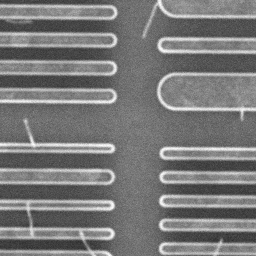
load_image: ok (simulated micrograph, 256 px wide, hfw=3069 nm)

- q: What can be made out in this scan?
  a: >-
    groups of lines, slits or small figures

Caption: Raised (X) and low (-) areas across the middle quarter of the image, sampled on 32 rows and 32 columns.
XXXXXXXXXXXXX-------------------
XXXXXXXXXXXXX-------------------
--------------------------------
-------------------------XXXXXXX
------------------------XXXXXXXX
------------------------XXXXXXXX
------------------------XXXXXXXX
XXXXXXXXXXXXX-----------XXXXXXXX
XXXXXXXXXXXXX-----------XXXXXXXX
------------------------XXXXXXXX
--------------------------XXXXXX
--------------------------------
--------------------------------
--------------------------------
--------------------------------
--------------------------------
--------------------------------
--------------------------------
--------------------------------
--------------------------------
XXXXXXXXXXXX--------------------
XXXXXXXXXXXX-------------XXXXXXX
------------------------XXXXXXXX
-------------------------XXXXXXX
--------------------------------
--------------------------------
--------------------------------
XXXXXXXXXXXX-------------XXXXXXX
XXXXXXXXXXXX------------XXXXXXXX
XXXXXXXXXXXX-------------XXXXXXX
--------------------------------
--------------------------------